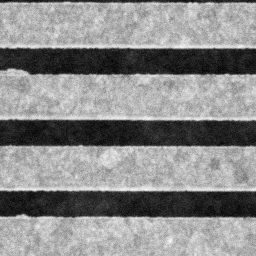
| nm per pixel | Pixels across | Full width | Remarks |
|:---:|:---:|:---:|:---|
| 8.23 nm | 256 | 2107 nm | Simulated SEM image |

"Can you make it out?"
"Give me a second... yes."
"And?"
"lines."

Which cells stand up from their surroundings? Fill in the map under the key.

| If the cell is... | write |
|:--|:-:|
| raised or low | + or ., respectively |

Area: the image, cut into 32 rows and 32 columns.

++++++++++++++++++++++++++++++++
++++++++++++++++++++++++++++++++
++++++++++++++++++++++++++++++++
++++++++++++++++++++++++++++++++
++++++++++++++++++++++++++++++++
++++++++++++++++++++++++++++++++
................................
................................
................................
++++++++++++++++++++++++++++++++
++++++++++++++++++++++++++++++++
++++++++++++++++++++++++++++++++
++++++++++++++++++++++++++++++++
++++++++++++++++++++++++++++++++
++++++++++++++++++++++++++++++++
................................
................................
................................
++++++++++++++++++++++++++++++++
++++++++++++++++++++++++++++++++
++++++++++++++++++++++++++++++++
++++++++++++++++++++++++++++++++
++++++++++++++++++++++++++++++++
++++++++++++++++++++++++++++++++
................................
................................
................................
++++++++++++++++++++++++++++++++
++++++++++++++++++++++++++++++++
++++++++++++++++++++++++++++++++
++++++++++++++++++++++++++++++++
++++++++++++++++++++++++++++++++